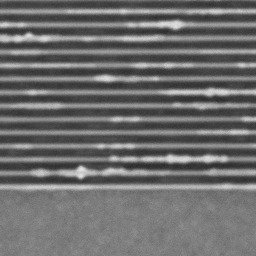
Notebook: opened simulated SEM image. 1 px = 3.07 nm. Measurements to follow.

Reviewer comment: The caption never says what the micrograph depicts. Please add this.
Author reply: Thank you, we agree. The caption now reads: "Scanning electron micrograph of parallel lines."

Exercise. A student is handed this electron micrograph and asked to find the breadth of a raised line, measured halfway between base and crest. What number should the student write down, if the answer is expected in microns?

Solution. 0.0134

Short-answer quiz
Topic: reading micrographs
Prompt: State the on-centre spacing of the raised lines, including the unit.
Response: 41.3 nm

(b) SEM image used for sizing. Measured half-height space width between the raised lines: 29.1 nm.